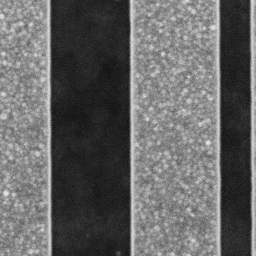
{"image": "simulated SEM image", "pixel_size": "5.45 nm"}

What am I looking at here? one or a few lines or trenches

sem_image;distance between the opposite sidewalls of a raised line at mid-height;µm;0.48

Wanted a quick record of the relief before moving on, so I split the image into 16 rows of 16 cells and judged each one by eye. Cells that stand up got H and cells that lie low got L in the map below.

HHHLLLLLHHHHHHLL
HHHLLLLLHHHHHHLL
HHHLLLLLHHHHHHLL
HHHLLLLLHHHHHHLL
HHHLLLLLHHHHHHLL
HHHLLLLLHHHHHHLL
HHHLLLLLHHHHHHLL
HHHLLLLLHHHHHHLL
HHHLLLLLHHHHHHLL
HHHLLLLLHHHHHHLL
HHHLLLLLHHHHHHLL
HHHLLLLLHHHHHHLL
HHHLLLLLHHHHHHLL
HHHLLLLLHHHHHHLL
HHHLLLLLHHHHHHLL
HHHLLLLLHHHHHHLL